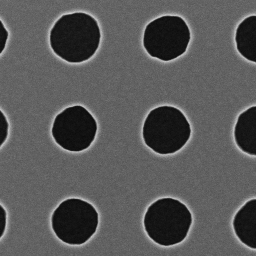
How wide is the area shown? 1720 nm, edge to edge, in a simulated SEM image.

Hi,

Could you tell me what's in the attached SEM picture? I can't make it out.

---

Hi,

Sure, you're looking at holes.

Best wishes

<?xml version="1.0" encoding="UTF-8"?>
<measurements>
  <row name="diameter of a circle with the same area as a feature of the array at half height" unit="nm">310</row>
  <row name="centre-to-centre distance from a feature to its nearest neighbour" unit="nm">615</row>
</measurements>